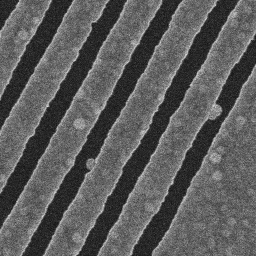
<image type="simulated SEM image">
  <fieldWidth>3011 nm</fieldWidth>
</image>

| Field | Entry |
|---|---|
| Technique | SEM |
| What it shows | parallel lines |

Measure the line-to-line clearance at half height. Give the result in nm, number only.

210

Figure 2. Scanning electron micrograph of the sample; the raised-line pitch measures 563 nanometers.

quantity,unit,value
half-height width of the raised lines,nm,345